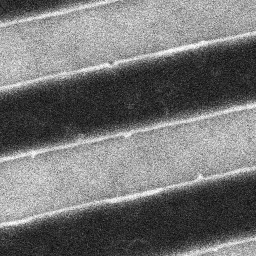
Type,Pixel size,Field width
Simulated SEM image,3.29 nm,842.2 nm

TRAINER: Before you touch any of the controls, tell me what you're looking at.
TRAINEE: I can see one or a few lines or trenches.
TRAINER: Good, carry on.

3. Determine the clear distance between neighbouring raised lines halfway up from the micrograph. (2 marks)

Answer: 196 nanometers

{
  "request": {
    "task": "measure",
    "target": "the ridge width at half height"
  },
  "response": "0.239 µm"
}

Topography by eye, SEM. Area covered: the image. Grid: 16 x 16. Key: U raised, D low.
UUUUUDDDDDDDDDDD
UDDDDDDDDDDDDDDD
DDDDDDDDDDDDDDUU
DDDDDDDDDUUUUUUU
DDDDDUUUUUUUUUUU
UUUUUUUUUUUUUUUU
UUUUUUUUUUUUUUUU
UUUUUUUUUUUUDDDD
UUUUUUUDDDDDDDDD
UUUDDDDDDDDDDDDD
DDDDDDDDDDDDDDDD
DDDDDDDDDDDUUUUU
DDDDDDDUUUUUUUUU
DDUUUUUUUUUUUUUU
UUUUUUUUUUUUUUUU
UUUUUUUUUUUUUUDD